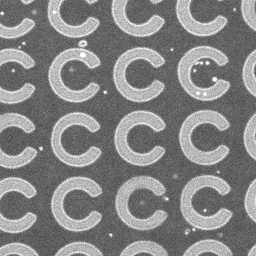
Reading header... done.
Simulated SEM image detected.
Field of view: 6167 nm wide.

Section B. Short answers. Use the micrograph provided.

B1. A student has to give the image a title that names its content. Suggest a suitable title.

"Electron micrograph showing an array of small figures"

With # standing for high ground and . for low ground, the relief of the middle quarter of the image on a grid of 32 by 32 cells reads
######..#####..##############...
#############..##############..#
#############..##############..#
#############..##############..#
#############..##############...
######..#####...######...#####..
.####...######..........#######.
.......########........#########
......##########......##########
################################
################################
################################
##..#############.....##########
.......########.........#######.
........######...........#####..
.####....#####...#####...#####..
#######.#####...#######.#####...
#############..##############..#
#############..##############..#
#############..##############...
#############...#############...
#######..#####...######..#####..
.####....#####....###....#####..
........#######.........#######.
.......##########.....##########
################################
################################
################################
###..#############...###########
.......#########.......#########
........#######.........#######.
.####....#####...#####...#####..